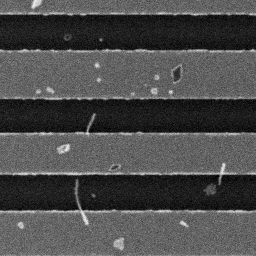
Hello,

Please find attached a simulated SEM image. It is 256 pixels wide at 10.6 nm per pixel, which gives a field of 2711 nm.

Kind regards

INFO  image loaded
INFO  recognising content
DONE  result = lines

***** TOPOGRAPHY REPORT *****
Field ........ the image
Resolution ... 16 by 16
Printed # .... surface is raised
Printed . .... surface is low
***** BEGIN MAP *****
################
................
................
################
################
################
................
................
################
################
################
................
................
################
################
################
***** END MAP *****